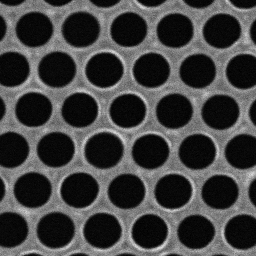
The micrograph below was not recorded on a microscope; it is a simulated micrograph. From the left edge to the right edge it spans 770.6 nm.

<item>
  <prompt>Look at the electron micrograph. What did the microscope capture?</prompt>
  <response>a regular array of holes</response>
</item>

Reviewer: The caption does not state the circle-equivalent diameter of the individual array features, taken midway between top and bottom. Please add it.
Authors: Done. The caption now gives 111 nanometers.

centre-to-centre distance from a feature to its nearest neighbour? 0.139 µm